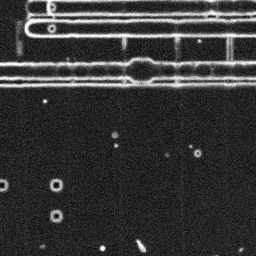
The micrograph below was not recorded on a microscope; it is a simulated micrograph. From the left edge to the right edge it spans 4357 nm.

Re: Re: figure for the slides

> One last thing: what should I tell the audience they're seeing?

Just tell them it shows wiring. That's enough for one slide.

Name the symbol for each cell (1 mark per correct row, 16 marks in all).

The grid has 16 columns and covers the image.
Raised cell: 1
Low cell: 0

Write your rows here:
0001111111111111
0011111111111111
0000000000000000
0000000000000000
1111111111111111
1111111111111111
1111111111111111
1111111111111111
1111111111111111
1111111111111111
1111111111111111
1111111111111111
1111111111111111
1111111111111111
1111111111111111
1111111111111111